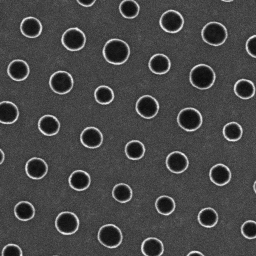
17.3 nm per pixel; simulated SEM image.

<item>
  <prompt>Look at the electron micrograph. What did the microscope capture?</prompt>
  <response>a regular array of raised bodies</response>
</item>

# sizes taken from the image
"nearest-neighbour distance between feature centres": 765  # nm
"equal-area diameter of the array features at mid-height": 362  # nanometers